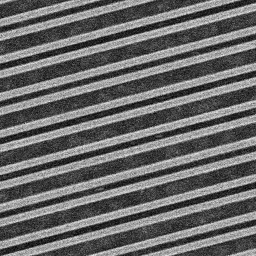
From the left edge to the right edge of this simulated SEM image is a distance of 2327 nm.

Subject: parallel lines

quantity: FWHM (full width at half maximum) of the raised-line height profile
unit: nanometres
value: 60.4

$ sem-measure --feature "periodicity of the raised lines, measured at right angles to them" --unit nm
162